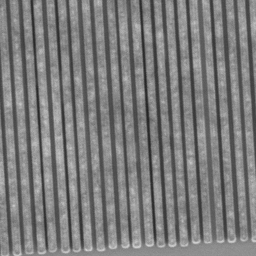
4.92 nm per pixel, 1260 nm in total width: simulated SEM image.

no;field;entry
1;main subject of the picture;parallel lines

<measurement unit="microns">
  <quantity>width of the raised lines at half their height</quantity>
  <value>0.0381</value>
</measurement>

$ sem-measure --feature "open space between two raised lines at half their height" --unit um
0.0239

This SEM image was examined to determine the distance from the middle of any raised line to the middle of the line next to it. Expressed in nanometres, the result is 58.9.